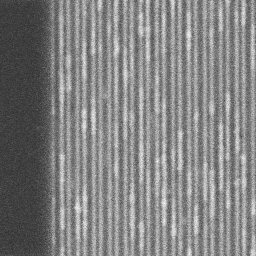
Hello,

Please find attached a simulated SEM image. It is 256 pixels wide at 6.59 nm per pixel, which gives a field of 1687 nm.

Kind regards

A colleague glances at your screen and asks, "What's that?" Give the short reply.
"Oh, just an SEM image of parallel lines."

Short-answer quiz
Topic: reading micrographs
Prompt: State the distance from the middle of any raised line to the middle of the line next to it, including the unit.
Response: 0.0525 µm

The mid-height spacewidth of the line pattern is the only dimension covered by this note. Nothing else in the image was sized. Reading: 38.7 nm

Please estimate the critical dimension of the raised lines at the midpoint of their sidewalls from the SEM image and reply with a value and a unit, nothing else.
19.8 nm